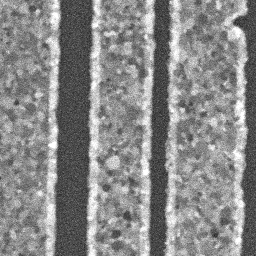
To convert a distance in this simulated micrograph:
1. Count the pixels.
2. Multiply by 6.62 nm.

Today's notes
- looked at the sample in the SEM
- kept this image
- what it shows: one or a few lines or trenches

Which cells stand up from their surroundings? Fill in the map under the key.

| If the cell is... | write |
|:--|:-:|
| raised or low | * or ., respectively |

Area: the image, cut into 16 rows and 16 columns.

***...***..****.
***...***..****.
***...***..****.
***...***..****.
***...***..****.
***...***..****.
***...***..****.
***...***..****.
***...***..****.
***...***..****.
***...***..****.
***...***..****.
***...***..****.
***...***..****.
***...***..****.
***...***..****.